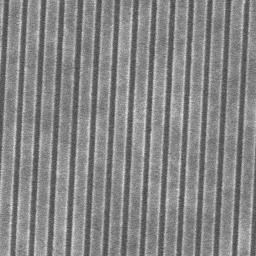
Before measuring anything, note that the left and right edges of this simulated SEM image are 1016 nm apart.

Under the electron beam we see parallel lines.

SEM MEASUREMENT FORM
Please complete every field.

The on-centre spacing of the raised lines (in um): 0.0733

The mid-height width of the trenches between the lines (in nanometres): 27.7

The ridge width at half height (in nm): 48.6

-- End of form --